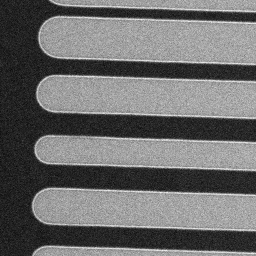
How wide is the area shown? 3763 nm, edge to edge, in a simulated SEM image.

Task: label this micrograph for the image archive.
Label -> groups of lines, slits or small figures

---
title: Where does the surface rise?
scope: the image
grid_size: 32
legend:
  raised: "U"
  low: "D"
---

UUUUUUUDDDDDDDDDDDDDDDDDDDDDDDDD
UUUUUUUUUUUUUUUUUUUUUUUUUUUUUUUU
UUUUUUDDDDDDDDDDDDDDUUUUUUUUUUUU
UUUUUDDDDDDDDDDDDDDDDDDDDDDDDDDD
UUUUUDDDDDDDDDDDDDDDDDDDDDDDDDDD
UUUUUDDDDDDDDDDDDDDDDDDDDDDDDDDD
UUUUUUDDDDDDDDDDDDDDDDDDDDDDDDDD
UUUUUUUUUUUUUUUDDDDDDDDDDDDDDDDD
UUUUUUUUUUUUUUUUUUUUUUUUUUUUUUUU
UUUUUUUDDUUUUUUUUUUUUUUUUUUUUUUU
UUUUUDDDDDDDDDDDDDDDDDDDDDDDDDDD
UUUUUDDDDDDDDDDDDDDDDDDDDDDDDDDD
UUUUUDDDDDDDDDDDDDDDDDDDDDDDDDDD
UUUUUUDDDDDDDDDDDDDDDDDDDDDDDDDD
UUUUUUUUUUUUUUUUUUUUUUUUDDDDDDDD
UUUUUUUUUUUUUUUUUUUUUUUUUUUUUUUU
UUUUUUUUUUUUUUUUUUUUUUUUUUUUUUUU
UUUUUDDDDDDDDDDDDDDDDDUUUUUUUUUU
UUUUDDDDDDDDDDDDDDDDDDDDDDDDDDDD
UUUUUDDDDDDDDDDDDDDDDDDDDDDDDDDD
UUUUUUUDDDDDDDDDDDDDDDDDDDDDDDDD
UUUUUUUUUUUUUUUUUUUUUUUUUUUUUUUU
UUUUUUUUUUUUUUUUUUUUUUUUUUUUUUUU
UUUUUUUUUUUUUUUUUUUUUUUUUUUUUUUU
UUUUUDDDDDDDDDDDDDDDDDDDDDDDDDDD
UUUUDDDDDDDDDDDDDDDDDDDDDDDDDDDD
UUUUDDDDDDDDDDDDDDDDDDDDDDDDDDDD
UUUUUDDDDDDDDDDDDDDDDDDDDDDDDDDD
UUUUUUUUUUUUUUUUUUUUUUUDDDDDDDDD
UUUUUUUUUUUUUUUUUUUUUUUUUUUUUUUU
UUUUUUUUUUUUUUUUUUUUUUUUUUUUUUUU
UUUUUDDDDDDDDDDDDDDDDDDDDDDDUUUU